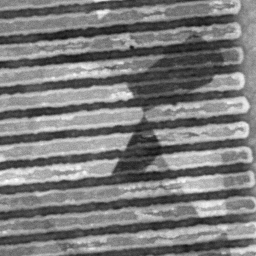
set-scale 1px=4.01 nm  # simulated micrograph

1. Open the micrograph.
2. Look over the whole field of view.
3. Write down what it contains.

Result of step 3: parallel lines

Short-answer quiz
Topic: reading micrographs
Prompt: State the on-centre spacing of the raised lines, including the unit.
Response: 99.8 nanometers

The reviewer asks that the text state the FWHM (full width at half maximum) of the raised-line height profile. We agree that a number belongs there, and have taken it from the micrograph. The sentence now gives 55.8 nanometers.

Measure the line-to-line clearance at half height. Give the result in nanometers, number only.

44.4